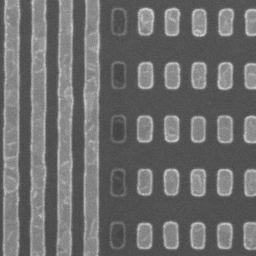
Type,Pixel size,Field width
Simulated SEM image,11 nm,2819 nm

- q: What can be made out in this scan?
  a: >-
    wiring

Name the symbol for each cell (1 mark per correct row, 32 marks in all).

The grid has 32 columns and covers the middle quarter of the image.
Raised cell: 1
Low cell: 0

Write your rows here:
11000111100011100001110001111000
11000111100011100001110001111000
11000111100011100001110001111000
11000111100011100001110001111000
11000111100011100001110001111000
11000111100011100001110001111000
11000111100000000000000000000000
11000111000000000000000000000000
11000111000000000000000000000000
11000111000000000000000000000000
11000111000000000000000000000000
11000111000000000000000000000000
11000111000000000000000000000000
11000111000011100001110001110000
11000111000011100011110001111000
11000111000011100011110001111000
11000111000011100011110001111000
11000111000011100011110001111000
11000111000011100011110001111000
11000111000000000000000000000000
11000111000000000000000000000000
11000111000000000000000000000000
11000111000000000000000000000000
11000111000000000000000000000000
11000111000000000000000000000000
11000111000000000000000000000000
11000111000001100001100000110000
11000111000011100001110001111000
11000111000011100001110001111000
11000111000011100001110001111000
11000111000011100011110001111000
11000111000011100011110001110000